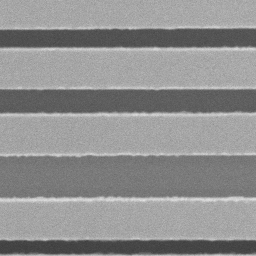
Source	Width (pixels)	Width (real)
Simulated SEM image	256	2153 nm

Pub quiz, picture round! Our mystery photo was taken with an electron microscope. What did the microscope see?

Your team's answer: lines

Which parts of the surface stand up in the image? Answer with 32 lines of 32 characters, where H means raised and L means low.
HHHHHHHHHHHHHHHHHHHHHHHHHHHHHHHH
HHHHHHHHHHHHHHHHHHHHHHHHHHHHHHHH
HHHHHHHHHHHHHHHHHHHHHHHHHHHHHHHH
HHHHHHHHHHHHHHHHHHLHHHLLLLLLLLLL
LLLLLLLLLLLLLLLLLLLLLLLLLLLLLLLL
LLLLLLLLLLLLLLLLLLLLLLLLLLLLLLLL
HHHHHHHHHHHHHHHHHHHHHHHHHHHHHHHH
HHHHHHHHHHHHHHHHHHHHHHHHHHHHHHHH
HHHHHHHHHHHHHHHHHHHHHHHHHHHHHHHH
HHHHHHHHHHHHHHHHHHHHHHHHHHHHHHHH
HHHHHHHHHHHHHHHHHHHHHHHHHHHHHHHH
LLLLLLLLLLLLLLLLLLLLLLLLLLLLLLLL
LLLLLLLLLLLLLLLLLLLLLLLLLLLLLLLL
LLLLLLLLLLLLLLLLLLLLLLLLLLLLLLLL
HHHHHHHHHHHHHHHHHHHHHHHHHHHHHHHH
HHHHHHHHHHHHHHHHHHHHHHHHHHHHHHHH
HHHHHHHHHHHHHHHHHHHHHHHHHHHHHHHH
HHHHHHHHHHHHHHHHHHHHHHHHHHHHHHHH
HHHHHHHHHHHHHHHHHHHHHHHHHHHHHHHH
LLLLLLLLLLLLLLLLLLLLLLLLLLLLLLLL
LLLLLLLLLLLLLLLLLLLLLLLLLLLLLLLL
LLLLLLLLLLLLLLLLLLLLLLLLLLLLLLLL
LLLLLLLLLLLLLLLLLLLLLLLLLLLLLLLL
LLLLLLLLLLLLLLLLLLLLLLLLLLLLLLLL
LLLLLLLLLLLLLLLLLLLLLLLLLLLLLLLL
HHHHHHHHHHHHHHHHHHHHHHHHHHHHHHHH
HHHHHHHHHHHHHHHHHHHHHHHHHHHHHHHH
HHHHHHHHHHHHHHHHHHHHHHHHHHHHHHHH
HHHHHHHHHHHHHHHHHHHHHHHHHHHHHHHH
HHHHHHHHHHHHHHHHHHHHHHHHHHHHHHHH
LLLLLLLLLLLLLLLLLLLLLLLLLLLLLLLL
LLLLLLLLLLLLLLLLLLLLLLLLLLLLLLLL